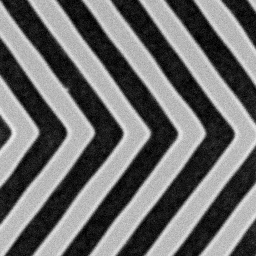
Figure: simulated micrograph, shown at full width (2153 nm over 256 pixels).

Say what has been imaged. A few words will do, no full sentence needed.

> groups of lines, slits or small figures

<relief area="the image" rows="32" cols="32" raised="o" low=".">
....ooo....ooo....ooo....ooo...o
o....ooo....ooo....ooo...oooo...
oo...oooo...ooo....ooo....ooo...
oo....ooo....ooo....ooo....ooo..
ooo....ooo....ooo....ooo...oooo.
.ooo....ooo...oooo...oooo...ooo.
.oooo...oooo...oooo...ooo....ooo
..ooo....ooo....ooo....ooo....oo
...ooo....ooo....ooo....ooo....o
....ooo....ooo...oooo...ooo....o
o...oooo...ooo....ooo....ooo....
o....ooo....ooo....ooo....ooo...
oo....ooo....ooo....ooo...oooo..
ooo...oooo....ooo...oooo...ooo..
oooo...ooo....ooo....ooo....ooo.
.ooo....ooo....ooo....ooo....ooo
..ooo...oooo...oooo...oooo...ooo
.ooo....ooo....ooo....ooo....ooo
oooo...oooo....ooo...ooo.....ooo
ooo....ooo....ooo....ooo....ooo.
oo....ooo....ooo....ooo....ooo..
o....ooo....ooo....ooo....ooo...
o...oooo...oooo...oooo...ooo....
....ooo....ooo....ooo....ooo....
...ooo....ooo....ooo....ooo....o
..ooo....ooo....ooo....ooo....oo
.oooo...oooo...ooo....oooo...ooo
.ooo....ooo...oooo....ooo...oooo
ooo....ooo....ooo....ooo....ooo.
oo....ooo....ooo....ooo....ooo..
o....oooo...ooo....oooo...oooo..
o....ooo....ooo....ooo...oooo...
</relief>